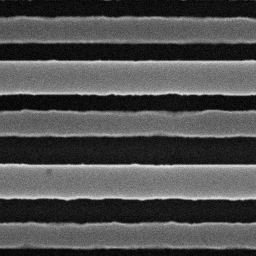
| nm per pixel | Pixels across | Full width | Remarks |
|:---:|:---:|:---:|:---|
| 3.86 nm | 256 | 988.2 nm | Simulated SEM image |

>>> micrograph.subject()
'lines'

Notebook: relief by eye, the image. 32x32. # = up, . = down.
................................
................................
################################
################################
################################
................................
................................
................................
################################
################################
################################
################################
................................
................................
################################
################################
################################
................................
................................
................................
................................
################################
################################
################################
################################
................................
................................
................................
################################
################################
################################
................................